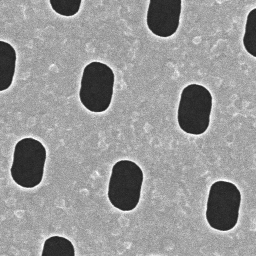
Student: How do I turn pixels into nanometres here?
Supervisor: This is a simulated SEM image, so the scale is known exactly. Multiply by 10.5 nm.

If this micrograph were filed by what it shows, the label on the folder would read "holes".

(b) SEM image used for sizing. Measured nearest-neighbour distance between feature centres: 1050 nm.